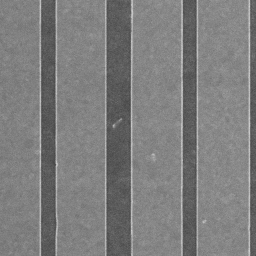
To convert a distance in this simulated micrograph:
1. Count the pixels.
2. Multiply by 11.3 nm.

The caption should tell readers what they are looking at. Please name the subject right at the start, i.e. one or a few lines or trenches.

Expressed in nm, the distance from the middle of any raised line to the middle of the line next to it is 807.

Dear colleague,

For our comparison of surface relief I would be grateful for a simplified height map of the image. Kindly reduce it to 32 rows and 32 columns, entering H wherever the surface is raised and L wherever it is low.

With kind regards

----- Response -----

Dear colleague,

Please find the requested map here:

HHHHHLLHHHHHHLLLLHHHHHHLLHHHHHHL
HHHHHLLHHHHHHLLLLHHHHHHLLHHHHHHL
HHHHHLLHHHHHHLLLLHHHHHHLLHHHHHHL
HHHHHLLHHHHHHLLLLHHHHHHLLHHHHHHL
HHHHHLLHHHHHHLLLLHHHHHHLLHHHHHHL
HHHHHLLHHHHHHLLLLHHHHHHLLHHHHHHL
HHHHHLLHHHHHHLLLLHHHHHHLLHHHHHHL
HHHHHLLHHHHHHLLLLHHHHHHLLHHHHHHL
HHHHHLLHHHHHHLLLLHHHHHHLLHHHHHHL
HHHHHLLHHHHHHLLLLHHHHHHLLHHHHHHL
HHHHHLLHHHHHHLLLHHHHHHHLLHHHHHHL
HHHHHLLHHHHHHLLLHHHHHHHLLHHHHHHL
HHHHHLLHHHHHHLLLHHHHHHHLLHHHHHHL
HHHHHLLHHHHHHLLLHHHHHHHLLHHHHHHL
HHHHHLLHHHHHHLLLHHHHHHHLLHHHHHHL
HHHHHLLHHHHHHLLLHHHHHHHLLHHHHHHL
HHHHHLLHHHHHHLLLLHHHHHHLLHHHHHHL
HHHHHLLHHHHHHLLLLHHHHHHLLHHHHHHL
HHHHHLLHHHHHHLLLLHHHHHHLLHHHHHHL
HHHHHLLHHHHHHLLLLHHHHHHLLHHHHHHL
HHHHHLLHHHHHHLLLLHHHHHHLLHHHHHHL
HHHHHLLHHHHHHLLLLHHHHHHLLHHHHHHL
HHHHHLLHHHHHHLLLLHHHHHHLLHHHHHHL
HHHHHLLHHHHHHLLLLHHHHHHLLHHHHHHL
HHHHHLLHHHHHHLLLLHHHHHHLLHHHHHHL
HHHHHLLHHHHHHLLLLHHHHHHLLHHHHHHL
HHHHHLLHHHHHHLLLLHHHHHHLLHHHHHHL
HHHHHLLHHHHHHLLLHHHHHHHLLHHHHHHL
HHHHHLLHHHHHHLLLLHHHHHHLLHHHHHHL
HHHHHLLHHHHHHLLLLHHHHHHLLHHHHHHL
HHHHHLLHHHHHHLLLLHHHHHHLLHHHHHHL
HHHHHLLHHHHHHLLLLHHHHHHLLHHHHHHL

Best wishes